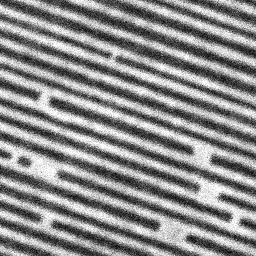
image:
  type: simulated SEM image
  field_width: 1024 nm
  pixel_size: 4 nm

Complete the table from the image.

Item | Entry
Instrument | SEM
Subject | parallel lines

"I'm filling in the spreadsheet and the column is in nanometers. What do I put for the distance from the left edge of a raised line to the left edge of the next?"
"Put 64.7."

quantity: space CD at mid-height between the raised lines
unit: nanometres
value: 41.3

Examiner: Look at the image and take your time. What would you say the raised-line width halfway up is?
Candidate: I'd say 24.4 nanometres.